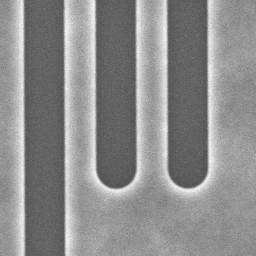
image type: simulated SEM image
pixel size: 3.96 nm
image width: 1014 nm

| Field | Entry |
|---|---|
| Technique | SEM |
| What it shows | groups of lines, slits or small figures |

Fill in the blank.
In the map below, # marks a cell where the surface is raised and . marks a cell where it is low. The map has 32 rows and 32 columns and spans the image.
###.....####.....####.....######
###.....####.....####.....######
###.....####.....####.....######
###.....####.....####.....######
###.....####.....####.....######
###.....####.....####.....######
###.....####.....####.....######
###.....####.....####.....######
###.....####.....####.....######
###.....####.....####.....######
###.....####.....####.....######
###.....####.....####.....######
###.....####.....####.....######
###.....####.....####.....######
###.....####.....####.....######
###.....####.....####.....######
###.....####.....####.....######
###.....####.....####.....######
###.....####.....####.....######
###.....####.....####.....######
###.....####.....####.....######
###.....####.....####.....######
###.....####.....####.....######
###.....######.########.########
###.....########################
###.....########################
###.....########################
###.....########################
###.....########################
###.....########################
###.....########################
###.....########################